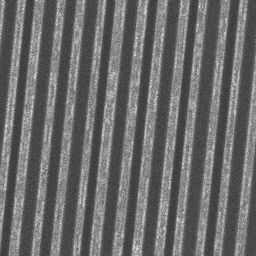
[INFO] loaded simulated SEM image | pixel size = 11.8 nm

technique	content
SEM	parallel lines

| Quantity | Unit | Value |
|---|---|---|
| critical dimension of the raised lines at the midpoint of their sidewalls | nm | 122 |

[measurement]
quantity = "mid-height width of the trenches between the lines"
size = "122 nm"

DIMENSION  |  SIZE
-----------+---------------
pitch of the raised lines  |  0.239 micrometres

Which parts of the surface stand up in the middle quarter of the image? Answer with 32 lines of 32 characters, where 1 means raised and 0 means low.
01110001100111000110001100011100
01110001100111000110001100011100
01110001100111000110001100011100
01110001100111001110011100011100
01100011100111001110011100011000
01100011100111001110011100011001
01100011000110001110011100011001
01100011001110001110011100011001
01100011001110001110011100011001
11100011001110001110011100011001
11100011001110001100011000111001
11100011001110001100011000111001
11100011001110001100011000111001
11100011001110011100111000111001
11000111001110011100111000110011
11000111001100011100111000110011
11000110011100011100111000110011
11000110011100011100111000110011
11000110011100011100111000110011
11000110011100011100110001110011
11000110011100011000110001110011
11000110011100011000110001110011
11000110011100011001110001110011
10001110011100111001110001100011
10001110011100111001110001100111
10001100011000111001110001100111
10001100111000111001110001100110
10001100111000111001110001100110
10001100111000111001110001100110
10001100111000110001100011100110
10001100111000110001100011100110
10001100111000110001100011100110